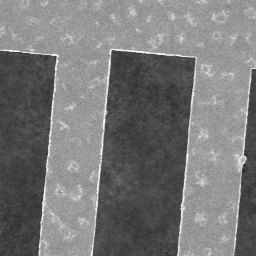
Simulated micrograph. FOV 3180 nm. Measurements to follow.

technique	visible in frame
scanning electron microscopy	one or a few lines or trenches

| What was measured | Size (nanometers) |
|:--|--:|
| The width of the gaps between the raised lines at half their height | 1050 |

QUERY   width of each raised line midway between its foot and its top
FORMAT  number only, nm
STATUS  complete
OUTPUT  685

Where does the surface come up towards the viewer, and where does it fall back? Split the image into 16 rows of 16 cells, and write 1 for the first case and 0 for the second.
1111111111111111
1111111111111111
1111111111111111
0001111000011111
0001111000001111
0001111000001111
0001111000001111
0001111000001110
0001110000001110
0001110000001110
0001110000001110
0001110000011110
0001110000011110
0001110000011110
0001110000011110
0011110000011110